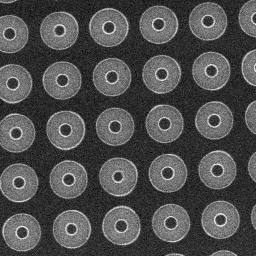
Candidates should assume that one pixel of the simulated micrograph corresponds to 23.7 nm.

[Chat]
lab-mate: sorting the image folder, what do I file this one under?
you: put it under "an array of small figures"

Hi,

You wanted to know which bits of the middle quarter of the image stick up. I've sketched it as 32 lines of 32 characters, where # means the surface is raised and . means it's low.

..######........####.........###
...#####........####...##....###
....###....##...####...###...###
#...###....##....###...###...###
#...####...##...####........####
....####........#####.......####
....#####......#######.....#####
...#######....##################
.###############################
################################
#######################....#####
###########....#######......####
...######.......#####........###
....#####........####...##...###
.....###....##...####...###...##
##...###...###...###....###...##
##...###....##...####........###
##...####........####........###
.....####.......######......####
....######.....#########..######
...#############################
################################
################################
#############.#########......###
..#########......#####........##
....######........####........##
.....####.........###....##....#
......###....#....###...###....#
###...###...###...###....##...##
###...###.........####........##
.....#####........#####......###
.....#####.......#######....####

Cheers